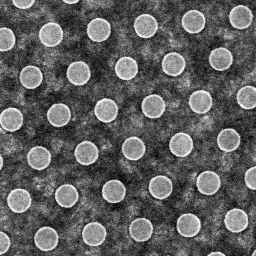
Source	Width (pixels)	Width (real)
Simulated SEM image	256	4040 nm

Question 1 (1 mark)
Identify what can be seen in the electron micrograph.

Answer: a regular array of raised bodies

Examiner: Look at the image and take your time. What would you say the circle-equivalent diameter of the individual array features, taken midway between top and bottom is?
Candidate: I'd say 357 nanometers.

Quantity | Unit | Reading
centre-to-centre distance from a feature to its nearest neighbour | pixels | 46.8